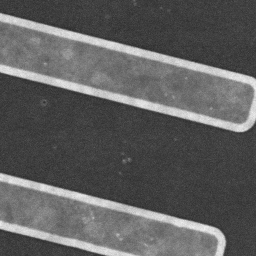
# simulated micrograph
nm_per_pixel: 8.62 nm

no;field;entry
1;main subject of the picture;one or a few lines or trenches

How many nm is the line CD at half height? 418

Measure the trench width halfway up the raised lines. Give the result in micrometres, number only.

0.921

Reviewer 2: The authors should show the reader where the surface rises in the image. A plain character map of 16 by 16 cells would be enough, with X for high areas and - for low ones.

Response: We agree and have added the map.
----------------
XX--------------
XXXXXX----------
XXXXXXXXXX------
-XXXXXXXXXXXX---
-----XXXXXXXXXXX
---------XXXXXXX
-------------XXX
----------------
----------------
----------------
XX--------------
XXXXXX----------
XXXXXXXXXX------
--XXXXXXXXXXX---
------XXXXXXXX--